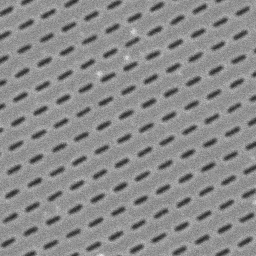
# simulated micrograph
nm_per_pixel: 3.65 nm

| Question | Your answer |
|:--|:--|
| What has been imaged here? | a regular array of holes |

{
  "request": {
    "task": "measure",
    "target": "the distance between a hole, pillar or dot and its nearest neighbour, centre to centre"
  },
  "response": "87.7 nanometers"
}